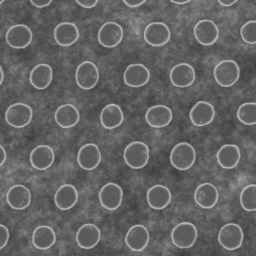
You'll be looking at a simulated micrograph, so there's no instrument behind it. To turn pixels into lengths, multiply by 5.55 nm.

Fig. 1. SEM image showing a regular array of raised bodies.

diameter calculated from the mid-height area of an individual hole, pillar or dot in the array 135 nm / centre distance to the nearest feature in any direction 250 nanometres